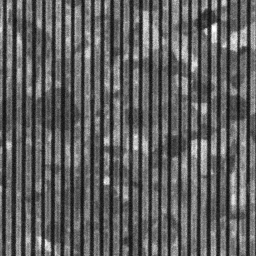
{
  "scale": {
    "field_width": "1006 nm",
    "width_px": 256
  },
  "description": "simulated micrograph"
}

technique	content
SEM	parallel lines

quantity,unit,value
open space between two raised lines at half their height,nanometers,17.7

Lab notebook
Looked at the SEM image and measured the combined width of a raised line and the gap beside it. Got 38.3 nanometres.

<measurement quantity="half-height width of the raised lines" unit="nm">17.7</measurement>